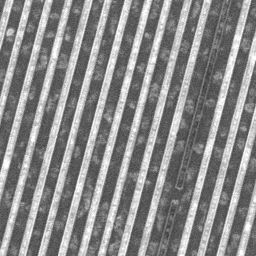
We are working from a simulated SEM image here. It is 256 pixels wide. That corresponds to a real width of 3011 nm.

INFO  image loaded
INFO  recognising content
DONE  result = parallel lines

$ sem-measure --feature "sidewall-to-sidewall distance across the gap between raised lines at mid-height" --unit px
12.9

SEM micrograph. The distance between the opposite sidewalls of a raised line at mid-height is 75.4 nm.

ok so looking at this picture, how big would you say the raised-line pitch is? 226 nm